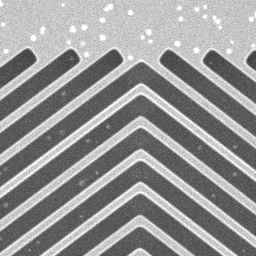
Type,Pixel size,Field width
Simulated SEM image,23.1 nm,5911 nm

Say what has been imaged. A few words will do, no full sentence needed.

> groups of lines, slits or small figures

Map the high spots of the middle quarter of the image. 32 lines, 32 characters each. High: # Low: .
...###........###....####.......
..###.......####.......###......
####.......####.........###.....
##........###............####...
#........###...............###..
.......####.......###.......###.
......###........#####.......###
....####.......########.......##
...####.......####...###........
..###........###......####......
####.......####.........###.....
###.......###............###....
#........###..............###...
.......####.......##.......####.
......###........#####.......###
.....###........#######.......##
...####.......####...###.......#
..####.......###......###.......
.###........###........####.....
###.......####..........####....
#........###..............###...
........###................###..
......####.......####.......####
.....###........######........##
....###........###..####.......#
..####.......####.....###.......
.###........###........###......
###.......####..........####....
##.......####............####...
........###................###..
.......###........###.......###.
.....####.......######.......###